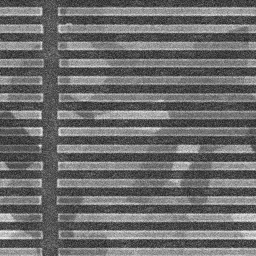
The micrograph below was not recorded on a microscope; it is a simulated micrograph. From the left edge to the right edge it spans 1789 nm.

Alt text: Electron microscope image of parallel lines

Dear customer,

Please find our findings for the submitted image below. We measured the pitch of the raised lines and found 120 nanometres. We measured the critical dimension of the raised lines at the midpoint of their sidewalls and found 7.5 pixels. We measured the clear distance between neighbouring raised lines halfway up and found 70.8 nanometres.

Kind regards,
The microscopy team